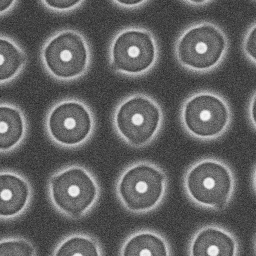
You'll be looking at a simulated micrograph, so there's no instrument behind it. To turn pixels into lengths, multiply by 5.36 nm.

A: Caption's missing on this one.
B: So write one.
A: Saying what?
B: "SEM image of an array of small figures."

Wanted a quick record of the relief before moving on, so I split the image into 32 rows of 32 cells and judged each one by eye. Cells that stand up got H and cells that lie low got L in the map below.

LHHHHHLLLHHHHHHLLHHHHHHHHHHHHHHH
HHHHHHHHHHHHHHHHHHHHHHHHHHHHHHHH
HHHHHHHHHHHHHHHHHHHHHHHHHHHHHHHH
HHHHHHHHHHHHHHHHHHHHHHHHHLLHHHHH
HHHHHHHLLLHHHHHLLLLHHHHLLLLLHHHL
LHHHHHLLLLHHHHLLLLLHHHLLLLLLHHHL
LLHHHHLLHLLHHHLLHLLHHHLLLLLLHHHL
LLLHHHLLLLLHHHLLLLLHHHHLLLLHHHHH
LLHHHHLLLLLHHHHLLLHHHHHHHLHHHHHH
LLHHHHHLLHHHHHHHHHHHHHHHHHHHHHHH
HHHHHHHHHHHHHHHHHHHHHHHHHHHHHHHH
HHHHHHHHHHHHHHHHHHHHHHHHHHHHHHHH
HHHHHHHHHHHHHHHHLLHHHHHHLLLHHHHH
LHHHHHHLLLHHHHHLLLLHHHHLLLLLHHHH
LLLHHHLLLLLHHHHLLLLLHHHLLHLLHHHH
HLLHHHLLHLLHHHHLLLLLHHHLLLLLHHHH
LLLHHHLLLLLHHHHLLLLHHHHHLLLHHHHH
LLHHHHHLLLHHHHHHLLHHHHHHHHHHHHHH
LHHHHHHHHHHHHHHHHHHHHHHHHHHHHHHH
HHHHHHHHHHHHHHHHHHHHHHHHHHHHHHHH
HHHHHHHHHHHHHHHHHHHHHHHHHLLHHHHH
HHHHHHHHLLHHHHHHLLLLHHHHLLLLHHHH
LLLHHHHLLLLHHHHLLLLLHHHLLLLLLHHH
LLLHHHHLLHLLHHHLLHLLHHHHLLLLLHHH
HLLHHHHLLLLLHHHLLLLLHHHHLLLLHHHH
LLLHHHHLLLLHHHHHLLLHHHHHHHLLHHHH
LLHHHHHHLLHHHHHHHHHHHHHHHHHHHHHH
HHHHHHHHHHHHHHHHHHHHHHHHHHHHHHHH
HHHHHHHHHHHHHHHHHHHHHHHHHHHHHHHH
HHHHHHHHHHHHHHHHHLLHHHHHHLLLLHHH
LLLHHHHHLLLLHHHHLLLLHHHHLLLLLHHH
LLLLHHHLLLLLHHHLLLLLLHHHLLHLLHHH